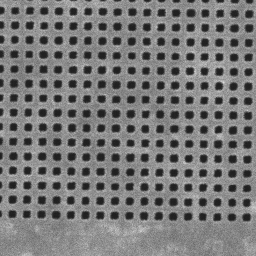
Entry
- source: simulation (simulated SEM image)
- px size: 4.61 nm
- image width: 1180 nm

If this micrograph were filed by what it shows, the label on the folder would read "a regular array of holes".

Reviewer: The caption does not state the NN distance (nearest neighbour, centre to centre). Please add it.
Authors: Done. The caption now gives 66 nm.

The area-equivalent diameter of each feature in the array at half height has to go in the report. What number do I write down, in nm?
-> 41.2